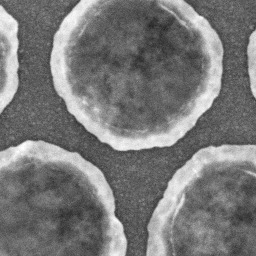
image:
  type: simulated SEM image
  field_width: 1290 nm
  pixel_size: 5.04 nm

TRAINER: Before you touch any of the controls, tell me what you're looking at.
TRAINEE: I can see raised bodies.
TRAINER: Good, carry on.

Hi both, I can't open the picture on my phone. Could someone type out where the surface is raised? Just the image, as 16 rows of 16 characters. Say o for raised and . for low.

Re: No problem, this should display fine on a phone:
.....oooooo.....
....oooooooo....
o...ooooooooo...
o...ooooooooo...
o...oooooooooo..
o...ooooooooo...
....ooooooooo...
.....ooooooo....
......ooooo.....
.oo.............
ooooo.......oooo
oooooo.....ooooo
ooooooo....ooooo
ooooooo...oooooo
ooooooo...oooooo
ooooooo...oooooo